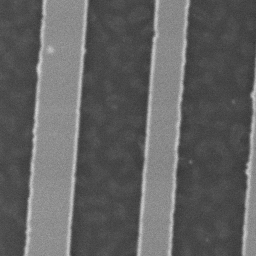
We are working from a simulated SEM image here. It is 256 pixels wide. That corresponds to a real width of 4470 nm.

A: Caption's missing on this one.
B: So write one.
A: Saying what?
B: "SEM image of one or a few lines or trenches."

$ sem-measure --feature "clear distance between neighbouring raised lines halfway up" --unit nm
1240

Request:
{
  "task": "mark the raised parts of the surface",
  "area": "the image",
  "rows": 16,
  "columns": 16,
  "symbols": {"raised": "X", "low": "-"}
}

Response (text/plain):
---XX-----XX----
---XX-----XX----
---XX-----XX----
---XX-----XX----
--XXX-----X-----
--XXX----XX-----
--XXX----XX-----
--XXX----XX-----
--XXX----XX-----
--XXX----XX-----
--XXX----XX-----
--XXX----XX-----
--XXX----XX----X
--XX-----XX----X
--XX-----XX----X
--XX-----XX----X